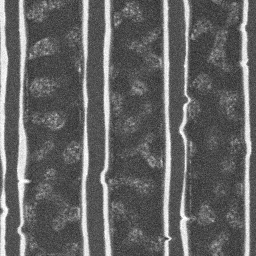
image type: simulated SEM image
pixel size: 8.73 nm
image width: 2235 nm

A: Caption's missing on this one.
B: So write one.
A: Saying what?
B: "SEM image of one or a few lines or trenches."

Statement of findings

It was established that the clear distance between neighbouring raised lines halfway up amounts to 60.9 px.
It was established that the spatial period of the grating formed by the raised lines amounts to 0.714 µm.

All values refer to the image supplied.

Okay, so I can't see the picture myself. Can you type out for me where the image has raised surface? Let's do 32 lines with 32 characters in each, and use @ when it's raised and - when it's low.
@@@--------@@--------@@--------@
@@@--------@@--------@@--------@
@@@--------@@--------@@--------@
@@@--------@@--------@@-------@@
@@@--------@@--------@@--------@
@@@--------@@--------@@--------@
@@@--------@@--------@@--------@
@@@--------@@--------@@--------@
-@@--------@@--------@@--------@
@@@--------@@--------@@--------@
@@@--------@@--------@@--------@
@@@--------@@--------@@--------@
@@@--------@@--------@@@-------@
@@@--------@@--------@@--------@
@@@--------@@--------@@--------@
@@@--------@@--------@@--------@
@@@--------@@--------@@--------@
@@@--------@@--------@@--------@
@@@--------@@--------@@--------@
@@@--------@@--------@@--------@
@@@--------@@--------@@--------@
-@@--------@@--------@@--------@
-@@--------@@--------@@--------@
@@@-------@@@--------@@--------@
@@@-------@@@--------@@--------@
@@@--------@@--------@@--------@
-@@--------@@--------@@--------@
@@@--------@@--------@@--------@
@@---------@@--------@@--------@
@@@--------@@--------@@--------@
@@@--------@@@-------@@--------@
@@@--------@@@-------@@--------@